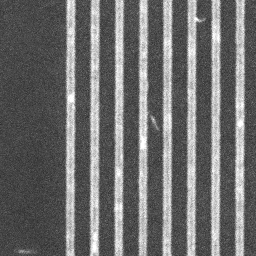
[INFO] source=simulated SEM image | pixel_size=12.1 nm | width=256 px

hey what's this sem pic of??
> parallel lines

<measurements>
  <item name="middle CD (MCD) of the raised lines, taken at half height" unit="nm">83.1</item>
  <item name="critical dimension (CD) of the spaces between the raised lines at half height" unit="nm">207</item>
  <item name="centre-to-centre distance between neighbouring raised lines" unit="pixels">24.2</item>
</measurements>